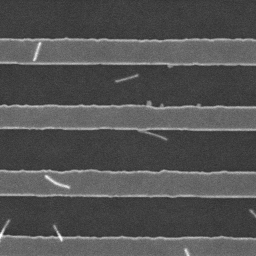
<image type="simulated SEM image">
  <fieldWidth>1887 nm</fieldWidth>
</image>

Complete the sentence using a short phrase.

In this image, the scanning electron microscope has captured lines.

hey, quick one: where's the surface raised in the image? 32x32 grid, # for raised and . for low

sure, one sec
................................
................................
................................
................................
................................
################################
################################
################################
................................
................................
................................
................................
................................
################################
################################
################################
................................
................................
................................
................................
................................
##############...##.###....##...
################################
################################
....#.....######################
................................
................................
................................
................................
##.....#........................
################################
################################